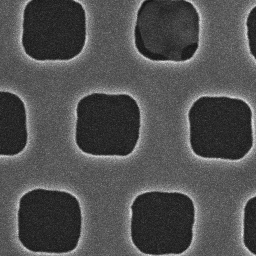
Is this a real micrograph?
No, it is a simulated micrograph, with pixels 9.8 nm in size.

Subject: holes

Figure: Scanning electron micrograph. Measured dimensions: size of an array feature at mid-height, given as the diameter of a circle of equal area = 667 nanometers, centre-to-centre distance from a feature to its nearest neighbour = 1100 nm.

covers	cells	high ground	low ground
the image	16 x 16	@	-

@@---@@@@---@@@@
@----@@@----@@@-
@----@@@----@@@-
@@---@@@@---@@@@
@@@@@@@@@@@@@@@@
@@@@@@@@@@@@@@@@
-@@@@----@@@---@
--@@@----@@@----
--@@@----@@@----
-@@@@---@@@@---@
@@@@@@@@@@@@@@@@
@@@@@@@@@@@@@@@@
@----@@@----@@@@
@----@@@----@@@-
@----@@@----@@@-
@@---@@@@---@@@-